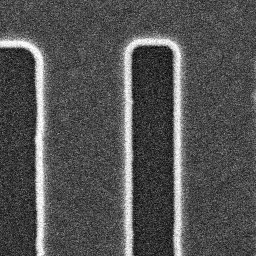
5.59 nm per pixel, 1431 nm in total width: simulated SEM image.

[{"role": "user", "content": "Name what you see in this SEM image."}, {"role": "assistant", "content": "one or a few lines or trenches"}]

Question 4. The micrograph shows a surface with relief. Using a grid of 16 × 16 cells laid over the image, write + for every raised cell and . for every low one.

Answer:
++++++++++++++++
++++++++++++++++
++++++++++++++++
..++++++...+++++
..++++++...+++++
..++++++...+++++
..++++++...+++++
...+++++...+++++
..++++++...+++++
..++++++...+++++
..++++++...+++++
..++++++...+++++
..++++++...+++++
...+++++...+++++
..++++++...+++++
..++++++...+++++